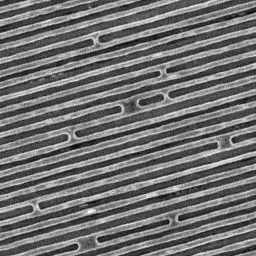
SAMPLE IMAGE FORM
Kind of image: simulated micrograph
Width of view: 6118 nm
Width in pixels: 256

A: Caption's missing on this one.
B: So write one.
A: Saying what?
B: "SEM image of parallel lines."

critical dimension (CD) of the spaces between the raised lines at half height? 0.167 microns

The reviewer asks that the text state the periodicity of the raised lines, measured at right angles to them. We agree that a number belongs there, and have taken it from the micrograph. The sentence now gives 288 nanometres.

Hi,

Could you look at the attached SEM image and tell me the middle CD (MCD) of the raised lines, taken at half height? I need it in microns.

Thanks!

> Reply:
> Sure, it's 0.124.